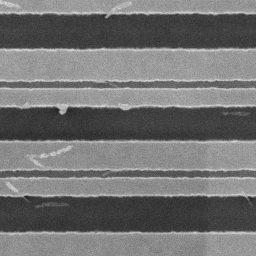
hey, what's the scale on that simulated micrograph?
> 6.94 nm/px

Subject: lines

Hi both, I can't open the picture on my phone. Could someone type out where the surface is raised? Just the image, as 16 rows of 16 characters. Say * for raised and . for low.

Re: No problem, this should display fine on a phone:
****************
................
................
****************
****************
****************
****************
................
................
****************
****************
****************
................
................
......*.........
****************